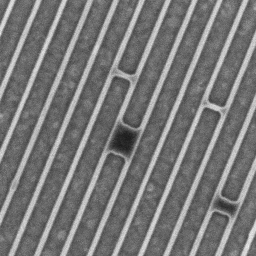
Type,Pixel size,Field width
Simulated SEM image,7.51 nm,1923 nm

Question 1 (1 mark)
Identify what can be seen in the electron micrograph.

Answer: parallel lines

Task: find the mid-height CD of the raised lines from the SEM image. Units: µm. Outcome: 0.033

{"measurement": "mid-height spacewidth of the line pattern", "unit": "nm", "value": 147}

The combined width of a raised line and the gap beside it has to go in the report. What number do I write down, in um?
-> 0.179